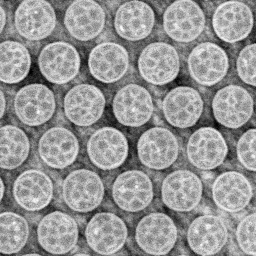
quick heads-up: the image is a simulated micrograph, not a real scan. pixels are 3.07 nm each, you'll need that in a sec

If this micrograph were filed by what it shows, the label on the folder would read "a regular array of raised bodies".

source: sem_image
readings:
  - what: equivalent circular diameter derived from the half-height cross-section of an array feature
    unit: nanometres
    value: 122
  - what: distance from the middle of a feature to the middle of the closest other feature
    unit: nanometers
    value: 150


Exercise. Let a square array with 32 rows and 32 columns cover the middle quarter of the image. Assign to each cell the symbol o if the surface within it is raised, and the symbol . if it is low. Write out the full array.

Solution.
oooo..oooooooooo...ooooooooo...o
ooo....oooooooo....ooooooooo....
ooo....oooooooo....ooooooooo....
oo......oooooo......ooooooo.....
..........o...........ooo.......
....ooo.........oo..............
..oooooo.......ooooo........oooo
.oooooooo.....ooooooo.....oooooo
.ooooooooo...ooooooooo....oooooo
oooooooooo...ooooooooo...ooooooo
oooooooooo...ooooooooo...ooooooo
.oooooooo....ooooooooo...ooooooo
.oooooooo....ooooooooo...ooooooo
.oooooooo....oooooooo.....oooooo
...oooo.......oooooo......oooooo
.............................oo.
.........oooo.........ooo.......
oo......oooooo......ooooooo.....
ooo....oooooooo....ooooooooo....
ooo...ooooooooo....ooooooooo...o
ooo...ooooooooo....ooooooooo...o
ooo...ooooooooo....ooooooooo...o
ooo...ooooooooo....ooooooooo...o
ooo....oooooooo....ooooooooo...o
oo.....ooooooo......ooooooo.....
.........oooo........ooooo......
................................
..oooooo.......ooooo.......ooooo
.ooooooo......ooooooo.....oooooo
ooooooooo....ooooooooo...ooooooo
ooooooooo....ooooooooo...ooooooo
oooooooooo..oooooooooo...ooooooo